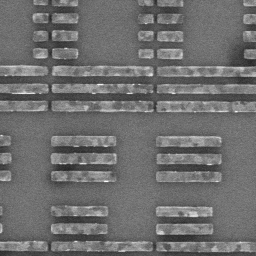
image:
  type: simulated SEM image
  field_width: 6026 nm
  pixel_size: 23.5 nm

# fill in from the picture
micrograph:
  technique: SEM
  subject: wiring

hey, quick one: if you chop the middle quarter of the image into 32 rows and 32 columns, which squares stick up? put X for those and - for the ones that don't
--------------------------------
XXXXXXXXXXXXXXXXXXXXXX--XXXXXXXX
XXXXXXXXXXXXXXXXXXXXXX-XXXXXXXXX
--------------------------------
--------------------------------
XXXXXXXXXXXXXXXXXXXXXX--XXXXXXXX
XXXXXXXXXXXXXXXXXXXXXX-XXXXXXXXX
--------------------------------
--------------------------------
XXXXXXXXXXXXXXXXXXXXXX--XXXXXXXX
XXXXXXXXXXXXXXXXXXXXXX-XXXXXXXXX
XXXXXXXXXXXXXXXXXXXXXX-XXXXXXXXX
--------------------------------
--------------------------------
--------------------------------
--------------------------------
--------------------------------
--------------------------------
XXXXXXXXXXXXX-----------XXXXXXXX
XXXXXXXXXXXXX----------XXXXXXXXX
------------------------XX-XXXXX
--------------------------------
XXXXXXXXXXXXX-------------------
XXXXXXXXXXXXX----------XXXXXXXXX
XXXXXXXXXXXXX----------XXXXXXXXX
--------------------------------
--------------------------------
XXXXXXXXXXXXX----------XXXXXXXXX
XXXXXXXXXXXXX----------XXXXXXXXX
--------------------------------
--------------------------------
--------------------------------